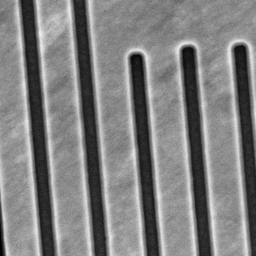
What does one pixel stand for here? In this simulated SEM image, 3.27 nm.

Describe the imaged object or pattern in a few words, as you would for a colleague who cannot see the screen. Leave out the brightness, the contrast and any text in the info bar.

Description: parallel lines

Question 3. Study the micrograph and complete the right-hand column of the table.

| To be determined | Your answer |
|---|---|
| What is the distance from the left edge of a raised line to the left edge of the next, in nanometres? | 170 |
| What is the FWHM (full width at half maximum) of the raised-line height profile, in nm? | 117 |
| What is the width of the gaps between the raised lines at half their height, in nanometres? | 51.7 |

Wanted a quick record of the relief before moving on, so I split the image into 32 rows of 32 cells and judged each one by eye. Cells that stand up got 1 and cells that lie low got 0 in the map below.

11001111100111111111111111111111
11100111100111111111111111111111
11100111100111111111111111111111
11100111100111111111111111111111
11100111100111111111111111111111
11100111100111111111111111111011
11100111100111111111111011111001
11100111110011110011111001111001
11100111110011110011111001111001
11100111110011110011111001111001
11100111110011110011111001111001
11100111110011110011111001111001
11100011110011110011111001111000
11110011110011110001111001111100
11110011110011111001111001111100
11110011110011111001111001111100
11110011110011111001111001111100
11110011110011111001111001111100
11110011110011111001111100111100
11110011111001111001111100111100
11110011111001111001111100111100
11110011111001111001111100111100
11110011111001111001111100111100
11110011111001111001111100111100
11110011111001111001111100111110
11111001111001111100111100111110
11111001111001111100111100111110
11111001111001111100111100111110
11111001111001111100111100111110
11111001111001111100111100011110
11111001111000111100111110011110
01111001111100111100111110011110